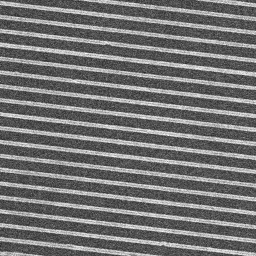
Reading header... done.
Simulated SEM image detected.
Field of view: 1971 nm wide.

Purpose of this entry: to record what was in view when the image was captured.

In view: parallel lines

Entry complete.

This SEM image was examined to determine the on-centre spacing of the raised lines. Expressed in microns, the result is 0.106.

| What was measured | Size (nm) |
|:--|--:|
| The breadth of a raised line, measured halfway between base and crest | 25.8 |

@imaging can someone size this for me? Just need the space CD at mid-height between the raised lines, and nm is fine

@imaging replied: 85.1